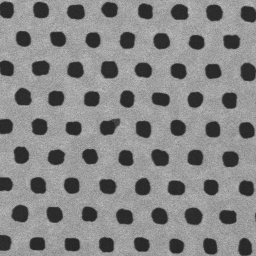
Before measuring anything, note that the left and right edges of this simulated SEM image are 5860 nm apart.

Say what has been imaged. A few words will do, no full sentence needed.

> a regular array of holes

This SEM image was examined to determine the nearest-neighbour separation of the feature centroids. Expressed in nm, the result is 759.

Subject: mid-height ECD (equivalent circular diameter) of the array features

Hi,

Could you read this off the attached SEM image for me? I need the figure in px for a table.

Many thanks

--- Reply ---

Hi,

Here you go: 16.4